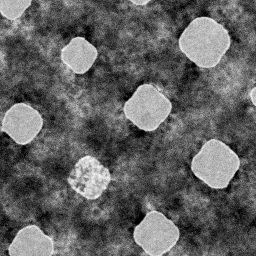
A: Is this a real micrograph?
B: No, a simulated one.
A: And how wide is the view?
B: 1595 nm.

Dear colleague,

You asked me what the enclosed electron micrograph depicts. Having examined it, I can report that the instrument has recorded raised bodies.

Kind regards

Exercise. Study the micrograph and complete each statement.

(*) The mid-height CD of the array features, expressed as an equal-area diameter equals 269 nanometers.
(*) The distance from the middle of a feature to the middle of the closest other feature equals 543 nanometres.